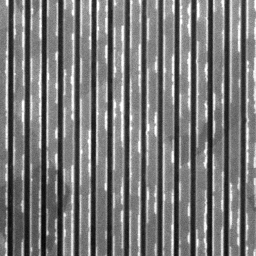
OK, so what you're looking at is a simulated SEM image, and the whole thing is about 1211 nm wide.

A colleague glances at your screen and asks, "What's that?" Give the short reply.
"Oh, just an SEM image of parallel lines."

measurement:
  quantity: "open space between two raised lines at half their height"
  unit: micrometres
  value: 0.0272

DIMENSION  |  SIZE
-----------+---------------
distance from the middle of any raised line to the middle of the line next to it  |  0.0785 microns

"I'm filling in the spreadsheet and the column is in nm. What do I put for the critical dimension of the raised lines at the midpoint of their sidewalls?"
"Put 53.8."